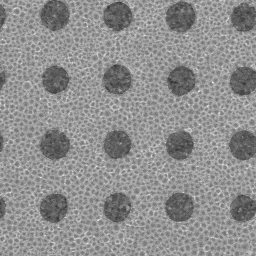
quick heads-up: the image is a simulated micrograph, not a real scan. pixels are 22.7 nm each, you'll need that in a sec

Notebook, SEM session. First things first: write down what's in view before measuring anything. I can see a regular array of raised bodies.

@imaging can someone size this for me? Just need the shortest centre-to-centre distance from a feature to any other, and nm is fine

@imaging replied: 1150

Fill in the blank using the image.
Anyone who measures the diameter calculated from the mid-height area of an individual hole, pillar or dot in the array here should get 672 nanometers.